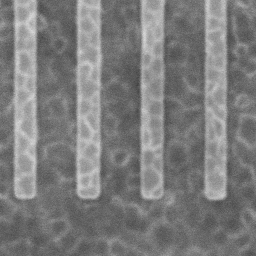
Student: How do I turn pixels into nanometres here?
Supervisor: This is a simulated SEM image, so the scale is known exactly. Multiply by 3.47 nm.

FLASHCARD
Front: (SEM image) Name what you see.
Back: one or a few lines or trenches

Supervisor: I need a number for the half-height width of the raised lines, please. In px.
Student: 20.4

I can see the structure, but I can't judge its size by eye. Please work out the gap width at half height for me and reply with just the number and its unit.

147 nanometers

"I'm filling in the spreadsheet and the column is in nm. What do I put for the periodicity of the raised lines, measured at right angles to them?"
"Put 220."